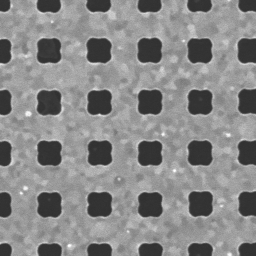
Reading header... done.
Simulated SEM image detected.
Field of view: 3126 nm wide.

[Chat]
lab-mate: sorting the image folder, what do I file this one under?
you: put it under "a regular array of holes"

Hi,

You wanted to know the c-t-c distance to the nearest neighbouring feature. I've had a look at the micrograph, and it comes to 612 nanometers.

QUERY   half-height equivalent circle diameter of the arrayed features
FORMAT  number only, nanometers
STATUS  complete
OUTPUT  330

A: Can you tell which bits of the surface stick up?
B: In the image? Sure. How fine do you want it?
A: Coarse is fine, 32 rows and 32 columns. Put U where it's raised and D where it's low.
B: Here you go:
DUUUUDDDUUUDDDUUUDDDUUUDDDUUUUDD
UUUUUDDUUUUUDUUUUUDDUUUUDUUUUUUU
UUUUUUUUUUUUUUUUUUUUUUUUUUUUUUUU
UUUUUUUUUUUUUUUUUUUUUUUUUUUUUUUU
UUUUUUUUUUUUUUUUUUUUUUUUUUUUUUUU
DUUUUDDDUUUDDDUUUDDDUUUDDDDUUUDD
DUUUUDDDUUUDDDUUUDDDUUUDDDDUUUDD
DUUUUDDUUUUDDDUUUDDDUUUUDDUUUUDD
UUUUUUUUUUUUUUUUUUUUUUUUUUUUUUUU
UUUUUUUUUUUUUUUUUUUUUUUUUUUUUUUU
UUUUUUUUUUUUUUUUUUUUUUUUUUUUUUUU
DUUUUDDUUUUDDDUUUUDDUUUUDDUUUUDD
DUUUUDDDUUUDDDUUUDDDUUUDDDDUUUDD
DUUUUDDDUUUDDDUUUDDDUUUDDDDUUUDD
UUUUUUUUUUUUUUUUUUUUUUUUUUUUUUUU
UUUUUUUUUUUUUUUUUUUUUUUUUUUUUUUU
UUUUUUUUUUUUUUUUUUUUUUUUUUUUUUUU
UUUUUUUUUUUUUUUUUUUUUUUUUUUUUUUU
DUUUUDDDUUUDDDUUUDDDUUUDDDDUUUDD
DUUUUDDDUUUDDDUUUDDDUUUDDDDUUUDD
DUUUUDDUUUUDDDUUUUDDUUUUDDUUUUDD
UUUUUUUUUUUUUUUUUUUUUUUUUUUUUUUU
UUUUUUUUUUUUUUUUUUUUUUUUUUUUUUUU
UUUUUUUUUUUUUUUUUUUUUUUUUUUUUUUU
DUUUUDDDUUUDDDUUUDDDUUUUDDDUUUDD
DUUUUDDDUUUDDDUUUDDDUUUUDDDUUUDD
DUUUUDDDUUUDDDUUUDDDUUUUDDUUUUDD
UUUUUUUUUUUUUUUUUUUUUUUUUUUUUUUU
UUUUUUUUUUUUUUUUUUUUUUUUUUUUUUUU
UUUUUUUUUUUUUUUUUUUUUUUUUUUUUUUU
DUUUUDDUUUUDDUUUUUDDUUUUDDUUUUDD
DUUUUDDDUUUDDDUUUDDDUUUUDDDUUUDD